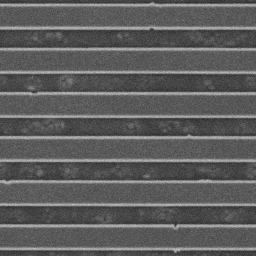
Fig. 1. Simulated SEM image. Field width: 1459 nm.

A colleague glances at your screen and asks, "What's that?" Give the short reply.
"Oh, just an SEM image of parallel lines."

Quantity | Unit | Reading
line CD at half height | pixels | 23.8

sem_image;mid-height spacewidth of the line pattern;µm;0.118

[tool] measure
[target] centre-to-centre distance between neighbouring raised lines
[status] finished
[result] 252 nm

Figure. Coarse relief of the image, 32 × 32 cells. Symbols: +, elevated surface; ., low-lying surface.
................................
++++++++++++++++++++++++++++++++
++++++++++++++++++++++++++++++++
................................
................................
................................
++++++++++++++++++++++++++++++++
++++++++++++++++++++++++++++++++
++++++++++++++++++++++++++++++++
................................
................................
................................
++++++++++++++++++++++++++++++++
++++++++++++++++++++++++++++++++
++++++++++++++++++++++++++++++++
................................
................................
++++++++++++++++++++++++++++++++
++++++++++++++++++++++++++++++++
++++++++++++++++++++++++++++++++
................................
................................
................................
++++++++++++++++++++++++++++++++
++++++++++++++++++++++++++++++++
++++++++++++++++++++++++++++++++
................................
................................
++++++++++++++++++++++++++++++++
++++++++++++++++++++++++++++++++
++++++++++++++++++++++++++++++++
................................